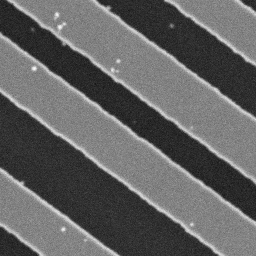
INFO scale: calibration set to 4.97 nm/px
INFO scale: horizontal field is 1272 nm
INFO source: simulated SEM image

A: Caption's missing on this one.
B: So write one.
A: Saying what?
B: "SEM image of lines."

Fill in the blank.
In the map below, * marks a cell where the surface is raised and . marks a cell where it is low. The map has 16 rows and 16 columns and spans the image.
.******....*****
..******....****
*...*****.....**
**...******....*
***....*****....
*****...*****...
.*****...******.
..*****....*****
....*****...****
.....*****...***
......*****....*
*.......*****...
***......*****..
****......*****.
.****.......****
..*****......***